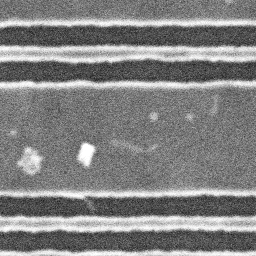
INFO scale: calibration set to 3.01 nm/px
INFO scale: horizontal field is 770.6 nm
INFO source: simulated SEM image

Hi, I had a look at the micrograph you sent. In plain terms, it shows lines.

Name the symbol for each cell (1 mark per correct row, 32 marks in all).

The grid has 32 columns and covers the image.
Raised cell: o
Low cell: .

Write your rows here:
oooooooooooooooooooooooooooooooo
oooooooooooooooooooooooooooooooo
oooooooooooooooooooooooooooooooo
................................
................................
................................
oooooooooooooooooooooooooooooooo
o.ooo..oooooooo.....ooo...o.ooo.
................................
................................
oooooooooooo.ooooooooooooooooooo
oooooooooooooooooooooooooooooooo
oooooooooooooooooooooooooooooooo
oooooooooooooooooooooooooooooooo
oooooooooooooooooooooooooooooooo
oooooooooooooooooooooooooooooooo
oooooooooooooooooooooooooooooooo
oooooooooooooooooooooooooooooooo
oooooooooooooooooooooooooooooooo
oooooooooooooooooooooooooooooooo
oooooooooooooooooooooooooooooooo
oooooooooooooooooooooooooooooooo
oooooooooooooooooooooooooooooooo
oooooooooooooooooooooooooooooooo
.........oo...o.................
................................
................................
oooooooooooooooooooooooooooooooo
oooooooooooooooooooooooooooooooo
................................
................................
.....oo............o..o.........